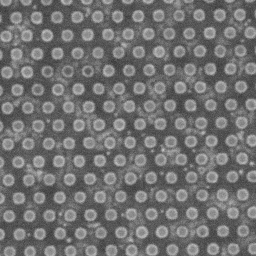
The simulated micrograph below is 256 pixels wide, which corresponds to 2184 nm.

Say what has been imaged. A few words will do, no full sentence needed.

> a regular array of raised bodies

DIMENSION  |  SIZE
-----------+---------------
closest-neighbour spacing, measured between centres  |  172 nm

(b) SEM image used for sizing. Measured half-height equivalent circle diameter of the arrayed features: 88.7 nanometers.